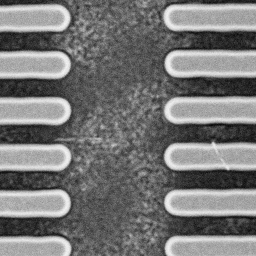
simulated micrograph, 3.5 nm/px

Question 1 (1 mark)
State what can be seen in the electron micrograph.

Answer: groups of lines, slits or small figures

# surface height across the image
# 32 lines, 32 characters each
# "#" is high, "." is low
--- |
................................
########.............###########
########.............###########
########..............##########
................................
................................
......................##########
########.............###########
########.............###########
########...................##.##
................................
................................
########..............##########
#########............###########
########.............###########
................................
................................
................................
########.............###########
#########............###########
########.............###########
................................
................................
................................
########.............###########
#########............###########
########..............##########
................................
................................
................................
########.............###########
#########............###########